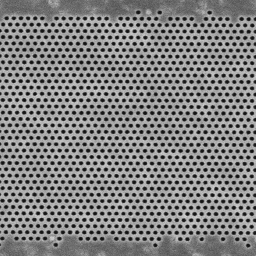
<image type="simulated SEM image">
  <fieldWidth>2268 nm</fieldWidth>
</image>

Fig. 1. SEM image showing a regular array of holes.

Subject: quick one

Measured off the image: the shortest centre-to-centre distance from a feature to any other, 59.7 nanometers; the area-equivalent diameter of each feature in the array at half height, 4.22 pixels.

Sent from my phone